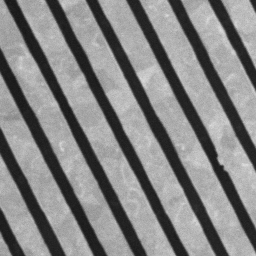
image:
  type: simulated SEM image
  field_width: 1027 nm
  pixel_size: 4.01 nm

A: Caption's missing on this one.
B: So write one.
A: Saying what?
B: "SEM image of parallel lines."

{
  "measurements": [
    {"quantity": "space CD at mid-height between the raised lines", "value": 48.2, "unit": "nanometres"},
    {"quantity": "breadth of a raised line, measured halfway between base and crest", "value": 0.0963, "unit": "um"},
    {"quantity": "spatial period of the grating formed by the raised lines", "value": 0.146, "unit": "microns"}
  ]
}